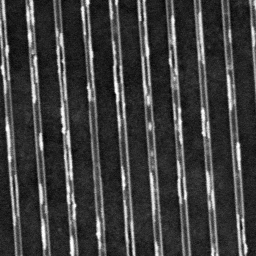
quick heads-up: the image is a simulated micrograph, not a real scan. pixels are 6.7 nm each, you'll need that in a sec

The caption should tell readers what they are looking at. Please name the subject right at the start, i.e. parallel lines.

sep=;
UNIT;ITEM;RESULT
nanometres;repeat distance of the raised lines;188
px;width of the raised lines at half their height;6.49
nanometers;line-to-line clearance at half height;142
